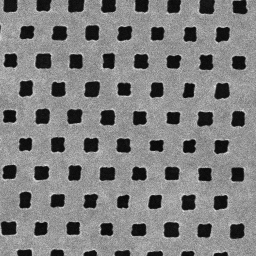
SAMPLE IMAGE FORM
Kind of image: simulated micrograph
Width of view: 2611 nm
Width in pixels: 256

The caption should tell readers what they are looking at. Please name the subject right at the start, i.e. a regular array of holes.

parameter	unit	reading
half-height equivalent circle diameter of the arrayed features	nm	154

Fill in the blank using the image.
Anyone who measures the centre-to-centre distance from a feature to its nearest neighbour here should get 325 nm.